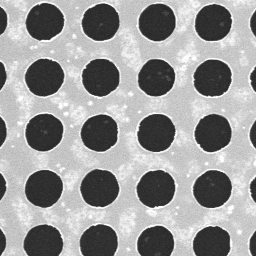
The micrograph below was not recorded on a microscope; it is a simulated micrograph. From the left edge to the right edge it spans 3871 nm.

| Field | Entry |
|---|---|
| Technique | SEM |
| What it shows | a regular array of holes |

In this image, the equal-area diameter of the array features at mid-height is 576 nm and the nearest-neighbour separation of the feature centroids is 836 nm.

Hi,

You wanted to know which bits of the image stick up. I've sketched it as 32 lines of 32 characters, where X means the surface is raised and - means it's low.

XXXXX-XXXXXXXXXXXXX-XXXXXXXXXXXX
-XXX----XXX----XXX----XXX----XXX
-XX-----XX-----XX-----XX-----XX-
-XX-----XX-----XX-----XX-----XX-
XXXX---XXXX---XXXX---XXXX---XXXX
XXXXXXXXXXXXXXXXXXXXXXXXXXXXXXXX
XXXXXXXXXXXXXXXXXXXXXXXXXXXXXXXX
XXXXX-XXXXXX-XXXXXX-XXXXXX-XXXXX
-XXX----XXX----XXX----XXX----XXX
-XX-----XX-----XX-----XX-----XX-
-XX-----XX-----XX-----XX-----XX-
XXXX---XXXX---XXXX---XXXX---XXXX
XXXXXXXXXXXXXXXXXXXXXXXXXXXXXXXX
XXXXXXXXXXXXXXXXXXXXXXXXXXXXXXXX
XXXX---XXXXX--XXXX---XXXXX--XXXX
-XX-----XX-----XX-----XXX----XXX
-XX-----XX-----XX-----XX-----XX-
-XX-----XX-----XX-----XX-----XX-
XXXX---XXXX---XXXX---XXXX---XXXX
XXXXXXXXXXXXXXXXXXXXXXXXXXXXXXXX
XXXXXXXXXXXXXXXXXXXXXXXXXXXXXXXX
XXXX---XXXX---XXXX---XXXXX--XXXX
-XX-----XX-----XX-----XXX----XXX
-XX-----XX-----XX-----XX-----XX-
XXX-----XX-----XX-----XX-----XX-
XXXX---XXXX---XXXX---XXXX---XXXX
XXXXXXXXXXXXXXXXXXXXXXXXXXXXXXXX
XXXXXXXXXXXXXXXXXXXXXXXXXXXXXXXX
XXXX---XXXX---XXXX---XXXXX--XXXX
-XX-----XX-----XX-----XX-----XX-
-XX-----XX-----XX-----XX-----XX-
XXX-----XX-----XX-----XX-----XX-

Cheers